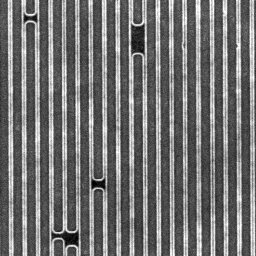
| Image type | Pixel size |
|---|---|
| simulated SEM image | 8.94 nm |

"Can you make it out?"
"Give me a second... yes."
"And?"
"parallel lines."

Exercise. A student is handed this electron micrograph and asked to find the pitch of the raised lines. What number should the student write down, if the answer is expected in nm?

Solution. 120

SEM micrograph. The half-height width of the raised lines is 0.0313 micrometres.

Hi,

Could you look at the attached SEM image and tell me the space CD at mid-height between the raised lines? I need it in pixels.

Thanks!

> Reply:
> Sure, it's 9.75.